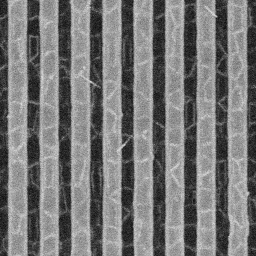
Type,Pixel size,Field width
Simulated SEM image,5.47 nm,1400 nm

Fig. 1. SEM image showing parallel lines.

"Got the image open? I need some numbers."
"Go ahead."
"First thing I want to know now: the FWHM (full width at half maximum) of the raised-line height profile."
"16 pixels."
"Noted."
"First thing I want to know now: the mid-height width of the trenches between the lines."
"0.0875 microns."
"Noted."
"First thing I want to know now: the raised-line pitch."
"172 nm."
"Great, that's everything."